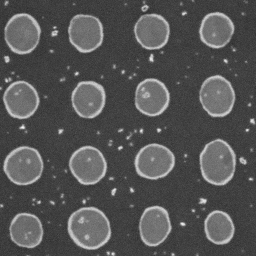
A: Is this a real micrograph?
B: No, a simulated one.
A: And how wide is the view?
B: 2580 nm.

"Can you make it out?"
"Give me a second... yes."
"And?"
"a regular array of raised bodies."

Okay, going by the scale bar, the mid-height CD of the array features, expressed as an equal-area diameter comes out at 353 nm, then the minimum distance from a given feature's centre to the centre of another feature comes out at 640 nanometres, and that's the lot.